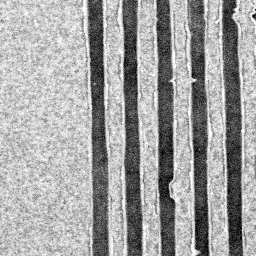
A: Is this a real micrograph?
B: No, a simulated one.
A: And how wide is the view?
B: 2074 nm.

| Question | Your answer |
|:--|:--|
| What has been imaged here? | parallel lines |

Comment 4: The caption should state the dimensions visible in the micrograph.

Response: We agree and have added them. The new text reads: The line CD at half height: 139 nanometres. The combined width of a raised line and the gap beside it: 272 nm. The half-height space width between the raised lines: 133 nm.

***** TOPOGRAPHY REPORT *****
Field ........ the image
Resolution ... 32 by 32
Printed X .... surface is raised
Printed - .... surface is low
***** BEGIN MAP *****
XXXXXXXXXXX--XX--XX--XX---XX--XX
XXXXXXXXXXX--XX--XX--XX---XX-XXX
XXXXXXXXXXX--XX--XX--XX---XX-XXX
XXXXXXXXXXX--XX--XX---X---XX--XX
XXXXXXXXXXX--XX--XX---XX--XX--XX
XXXXXXXXXXX--XX--XXX--XX--XX--XX
XXXXXXXXXXX--XX--XXX--XX--XX--XX
XXXXXXXXXXX--XX--XXX--XX--XX--XX
XXXXXXXXXXX--XX--XXX--XX--XX--XX
XXXXXXXXXXX--XX--XXX--XX--XX--XX
XXXXXXXXXXX--XX--XXX--XX--XX--XX
XXXXXXXXXXX--XX--XXX--XX--XX--XX
XXXXXXXXXXX--XX--XXX--XX--XX--XX
XXXXXXXXXXX--XX--XXX--XX--XX--XX
XXXXXXXXXXX--XX--XXX--XX--XX--XX
XXXXXXXXXXX--XX---XX--XX--XX--XX
XXXXXXXXXXX--XX---XX--XX--XX--XX
XXXXXXXXXXX--XX---XX--XX--XX--XX
XXXXXXXXXXX--XX---XX--XX--XX--XX
XXXXXXXXXXX---X---XX--XX--XX--XX
XXXXXXXXXXX---X---XX--XX--XX--XX
XXXXXXXXXXX---X---XX--XX--XX--XX
XXXXXXXXXXX---XX--XX--XX--XX--XX
XXXXXXXXXXX---XX--XX-XXX--XX--XX
XXXXXXXXXXX---XX--XX-XXX--XX--XX
XXXXXXXXXXX---XX--XX--XX--XX--XX
XXXXXXXXXXX---XX--XX--XX--XX--XX
XXXXXXXXXXX---XX--XX--XX--XX--XX
XXXXXXXXXXX---XX--XX--XX--XX--XX
XXXXXXXXXXX---XX--XX--XX--XX--XX
XXXXXXXXXXX---XX--XX--XX--XX--XX
XXXXXXXXXXX---XX--XX--XXX-XX--XX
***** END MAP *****